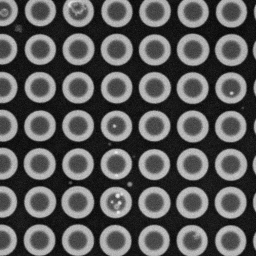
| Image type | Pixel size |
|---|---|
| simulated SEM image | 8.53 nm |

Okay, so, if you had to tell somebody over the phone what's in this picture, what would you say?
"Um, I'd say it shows an array of small figures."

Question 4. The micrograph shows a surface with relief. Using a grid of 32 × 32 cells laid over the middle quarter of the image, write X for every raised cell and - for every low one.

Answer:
--------------------------------
--------------------------------
--XXX------XXXX------XXX-------X
XXXXXXX---XXXXXX----XXXXXX---XXX
XXXXXXX---XXXXXXX--XXXXXXX---XXX
XXXXXXX--XXXXXXXX--XXXXXXXX-XXXX
XXXXXXX--XXXXXXXX--XXXXXXXX-XXXX
XXXXXXX---XXXXXXX--XXXXXXX---XXX
-XXXXXX---XXXXXX----XXXXXX---XXX
--XXX-------XXX------XXX------XX
--------------------------------
--------------------------------
-XXXXX-----XXXX-----XXXXX-----XX
XXXXXXX---XXXXXX---XXXXXXX---XXX
XXXXXXX--XXXXXXXX--XXXXXXX---XXX
XXXXXXX--XXXXXXXX--XXXXXXX--XXXX
XXXXXXX--XXXXXXXX--XXXXXXX--XXXX
XXXXXXX---XXXXXXX--XXXXXXX---XXX
-XXXXX-----XXXXX----XXXXX-----XX
--------------------------------
--------------------------------
--XXX-------XXX-------X--------X
-XXXXX----XXXXXX----XXXXX----XXX
XXXXXXX---XXXXXXX--XXXXXXX---XXX
XXXXXXX--XXXXXXXX--XXXXXXX--XXXX
XXXXXXX--XXXXXXXX--XXXXXXX--XXXX
XXXXXXX--XXXXXXXX--XXXXXXX---XXX
XXXXXXX---XXXXXX----XXXXXX---XXX
--XXX-------XXX------XXX------XX
--------------------------------
--------------------------------
-XXXXX-----XXXX-----XXXXX-----XX